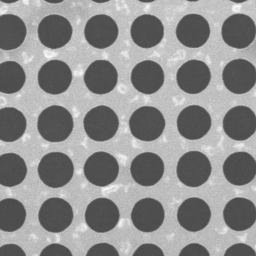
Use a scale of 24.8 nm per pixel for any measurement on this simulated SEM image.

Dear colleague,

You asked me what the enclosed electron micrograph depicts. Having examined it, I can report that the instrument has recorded a regular array of holes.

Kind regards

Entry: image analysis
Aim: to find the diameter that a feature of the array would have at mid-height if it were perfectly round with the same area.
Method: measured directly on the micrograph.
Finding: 862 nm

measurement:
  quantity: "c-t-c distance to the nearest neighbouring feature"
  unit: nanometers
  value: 1130